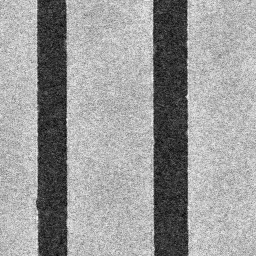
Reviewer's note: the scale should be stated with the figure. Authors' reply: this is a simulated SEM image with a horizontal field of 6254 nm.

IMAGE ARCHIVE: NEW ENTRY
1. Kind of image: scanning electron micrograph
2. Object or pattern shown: one or a few lines or trenches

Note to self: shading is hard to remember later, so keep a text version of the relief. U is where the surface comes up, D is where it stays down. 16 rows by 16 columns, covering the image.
UUDDUUUUUUDDUUUU
UUDDUUUUUUDDUUUU
UUDDUUUUUUDDUUUU
UUUDUUUUUUDDUUUU
UUDDUUUUUUDDUUUU
UUDDUUUUUUDDUUUU
UUDDUUUUUUDDUUUU
UUDDUUUUUUDDUUUU
UUDDUUUUUUDDUUUU
UUDDUUUUUUDDUUUU
UUDDUUUUUUDDUUUU
UUDDUUUUUUDDUUUU
UUDDUUUUUUDDUUUU
UUDDUUUUUUDDUUUU
UUDDUUUUUUDDUUUU
UUDDUUUUUUDDUUUU